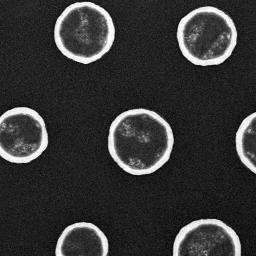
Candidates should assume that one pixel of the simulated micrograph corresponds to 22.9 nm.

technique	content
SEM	raised bodies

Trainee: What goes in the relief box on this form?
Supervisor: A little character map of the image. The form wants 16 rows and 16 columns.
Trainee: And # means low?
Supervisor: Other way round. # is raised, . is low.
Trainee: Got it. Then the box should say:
....##..........
....###....###..
....###....####.
....##......##..
................
................
................
##.....###......
###....####....#
##.....####....#
........##......
................
................
................
....##.....###..
....###....####.